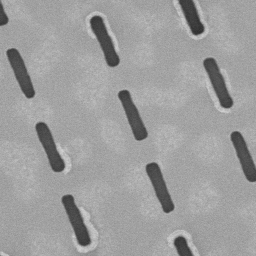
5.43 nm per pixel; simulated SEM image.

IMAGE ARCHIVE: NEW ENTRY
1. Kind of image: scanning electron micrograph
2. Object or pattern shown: holes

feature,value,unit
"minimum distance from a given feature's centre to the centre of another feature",0.422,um